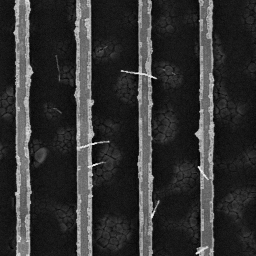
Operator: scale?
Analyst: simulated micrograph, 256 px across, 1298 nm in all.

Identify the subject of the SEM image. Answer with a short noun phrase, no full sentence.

one or a few lines or trenches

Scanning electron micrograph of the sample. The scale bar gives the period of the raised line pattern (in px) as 61.2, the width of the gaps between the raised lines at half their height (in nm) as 243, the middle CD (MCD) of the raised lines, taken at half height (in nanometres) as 67.9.